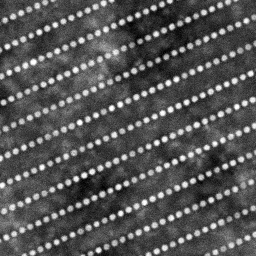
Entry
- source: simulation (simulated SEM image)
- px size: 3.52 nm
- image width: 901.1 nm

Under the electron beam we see a regular array of raised bodies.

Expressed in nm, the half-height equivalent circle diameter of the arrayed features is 17.3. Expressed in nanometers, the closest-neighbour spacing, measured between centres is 30.4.